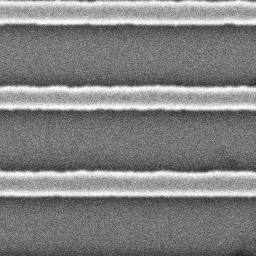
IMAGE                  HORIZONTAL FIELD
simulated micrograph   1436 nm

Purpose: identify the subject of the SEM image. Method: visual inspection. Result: lines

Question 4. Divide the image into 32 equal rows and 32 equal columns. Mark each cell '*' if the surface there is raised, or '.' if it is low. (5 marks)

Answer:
********************************
********************************
********************************
................................
................................
................................
................................
................................
................................
................................
................................
********************************
********************************
.*..********.***.***************
................................
................................
................................
................................
................................
................................
................................
.........**.*.......*......*....
********************************
********************************
..........................*....*
................................
................................
................................
................................
................................
................................
................................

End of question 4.